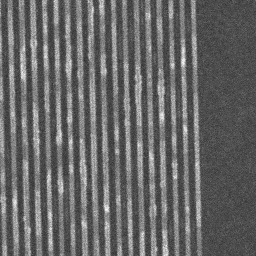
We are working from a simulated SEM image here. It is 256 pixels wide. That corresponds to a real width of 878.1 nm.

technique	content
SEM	parallel lines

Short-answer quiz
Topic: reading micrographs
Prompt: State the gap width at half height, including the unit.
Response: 25.7 nm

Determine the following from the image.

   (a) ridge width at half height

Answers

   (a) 0.0128 µm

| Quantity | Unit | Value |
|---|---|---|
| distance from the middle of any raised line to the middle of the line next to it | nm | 39.3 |